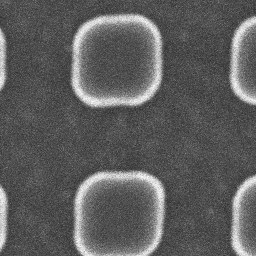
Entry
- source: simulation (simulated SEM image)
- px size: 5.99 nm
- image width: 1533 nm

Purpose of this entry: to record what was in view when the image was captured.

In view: raised bodies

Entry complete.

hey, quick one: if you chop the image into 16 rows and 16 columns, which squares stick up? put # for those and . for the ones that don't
................
......###......#
.....#####.....#
.....#####.....#
.....#####.....#
.....#####.....#
................
................
................
................
................
.....#####.....#
.....#####.....#
.....#####.....#
.....#####.....#
.....#####.....#